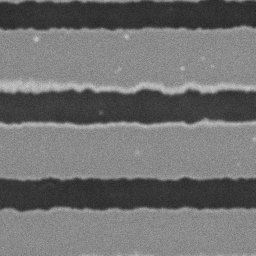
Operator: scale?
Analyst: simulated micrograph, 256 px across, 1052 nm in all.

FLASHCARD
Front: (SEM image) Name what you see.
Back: lines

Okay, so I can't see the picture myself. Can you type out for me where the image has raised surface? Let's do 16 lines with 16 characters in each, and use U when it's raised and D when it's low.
DDDDDDDDDDDDDDDD
DDDDDDDDDDDDDDDD
UUUUUUUUUUUUUUUU
UUUUUUUUUUUUUUUU
UUUUUUUUUUUUUUUU
UUUUUUUUUUUUUUUU
DDDDDDDDDDDDDDDD
DDDDDDDDDDDDDDDD
UUUUUUUUUUUUUUUU
UUUUUUUUUUUUUUUU
UUUUUUUUUUUUUUUU
DDDDDDDDDDDDDDDD
DDDDDDDDDDDDDDDD
UUUUUUUUUUUUUUUU
UUUUUUUUUUUUUUUU
UUUUUUUUUUUUUUUU